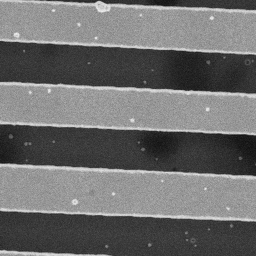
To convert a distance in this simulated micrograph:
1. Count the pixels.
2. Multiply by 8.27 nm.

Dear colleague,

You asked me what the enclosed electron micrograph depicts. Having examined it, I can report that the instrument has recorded lines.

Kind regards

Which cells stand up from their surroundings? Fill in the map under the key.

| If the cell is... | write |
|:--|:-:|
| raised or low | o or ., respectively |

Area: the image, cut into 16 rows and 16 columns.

ooooooooooooo...
oooooooooooooooo
oooooooooooooooo
................
................
ooooooooo.......
oooooooooooooooo
oooooooooooooooo
................
................
oooooo..........
oooooooooooooooo
oooooooooooooooo
........oooooooo
................
................